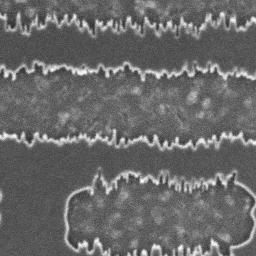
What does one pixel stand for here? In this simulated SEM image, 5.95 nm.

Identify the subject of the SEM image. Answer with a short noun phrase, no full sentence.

one or a few lines or trenches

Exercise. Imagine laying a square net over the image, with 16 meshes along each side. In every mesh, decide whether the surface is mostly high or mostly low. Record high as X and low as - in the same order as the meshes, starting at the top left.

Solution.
----------------
X-XXX-X------XXX
XXXXXXXXXXXXXXXX
XXXXXXXXXXXXXXXX
X----X---XXX--XX
----------------
----------------
----------------
X-------------X-
XXXXXXXXXXXXXXXX
XXXXXXXXXXXXXXXX
XXXXXX-----XX--X
XXXX------------
XXXX------------
XXXX------------
XXXXXX---------X